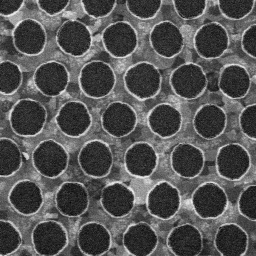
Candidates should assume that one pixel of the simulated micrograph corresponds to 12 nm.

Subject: a regular array of holes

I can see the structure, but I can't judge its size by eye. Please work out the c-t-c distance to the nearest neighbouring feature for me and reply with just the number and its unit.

544 nm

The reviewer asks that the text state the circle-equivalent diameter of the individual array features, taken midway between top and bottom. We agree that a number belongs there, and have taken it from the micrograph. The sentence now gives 418 nm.